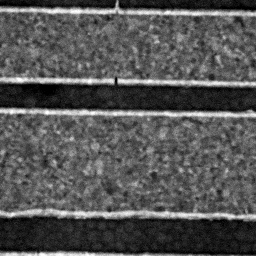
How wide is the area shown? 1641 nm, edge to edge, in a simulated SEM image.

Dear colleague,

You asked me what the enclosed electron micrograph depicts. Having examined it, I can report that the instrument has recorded one or a few lines or trenches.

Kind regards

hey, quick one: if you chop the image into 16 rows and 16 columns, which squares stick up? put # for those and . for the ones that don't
................
################
################
################
################
................
................
################
################
################
################
################
################
..............##
................
................